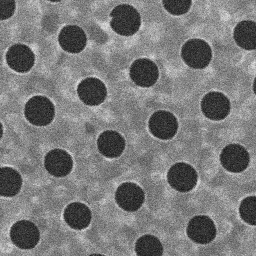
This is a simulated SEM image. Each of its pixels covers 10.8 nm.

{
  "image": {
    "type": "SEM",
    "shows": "a regular array of holes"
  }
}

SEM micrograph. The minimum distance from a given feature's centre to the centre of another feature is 0.6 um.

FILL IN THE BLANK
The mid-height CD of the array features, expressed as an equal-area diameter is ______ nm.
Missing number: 334